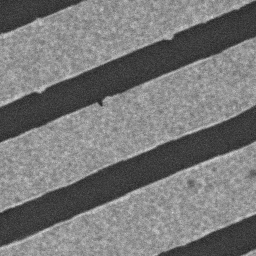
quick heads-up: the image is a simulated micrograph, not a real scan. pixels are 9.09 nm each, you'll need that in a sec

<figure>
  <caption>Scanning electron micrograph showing one or a few lines or trenches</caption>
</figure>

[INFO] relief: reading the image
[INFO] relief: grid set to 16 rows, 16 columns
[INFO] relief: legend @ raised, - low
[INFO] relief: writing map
----@@@@@@@@@@@-
--@@@@@@@@@@----
@@@@@@@@@@------
@@@@@@@@-----@@@
@@@@@------@@@@@
@@@-----@@@@@@@@
------@@@@@@@@@@
----@@@@@@@@@@--
-@@@@@@@@@@-----
@@@@@@@@@------@
@@@@@@------@@@@
@@@@------@@@@@@
@@-----@@@@@@@@@
-----@@@@@@@@@@@
---@@@@@@@@@@---
@@@@@@@@@@@-----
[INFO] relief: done